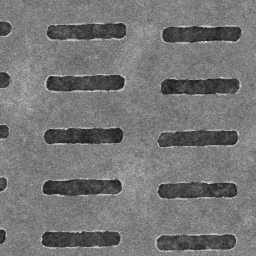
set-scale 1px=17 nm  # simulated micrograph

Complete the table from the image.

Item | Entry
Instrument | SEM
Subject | a regular array of holes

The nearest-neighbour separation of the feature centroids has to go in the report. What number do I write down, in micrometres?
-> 0.881